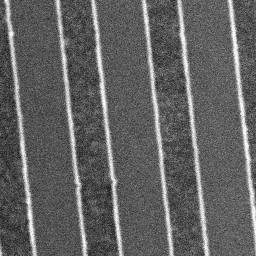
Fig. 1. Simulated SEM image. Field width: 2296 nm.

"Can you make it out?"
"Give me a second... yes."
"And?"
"one or a few lines or trenches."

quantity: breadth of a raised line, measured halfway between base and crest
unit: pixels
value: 35.7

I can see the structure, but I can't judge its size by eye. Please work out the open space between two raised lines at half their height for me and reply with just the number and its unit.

450 nm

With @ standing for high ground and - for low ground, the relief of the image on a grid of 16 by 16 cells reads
----@@---@@---@@
@---@@---@@----@
@---@@---@@----@
@---@@---@@@---@
@---@@---@@@---@
@---@@----@@---@
@---@@@---@@---@
@---@@@---@@---@
@----@@---@@---@
@----@@---@@---@
@@---@@---@@----
@@---@@---@@----
@@---@@---@@@---
@@---@@---@@@---
@@---@@----@@---
@@---@@@---@@---